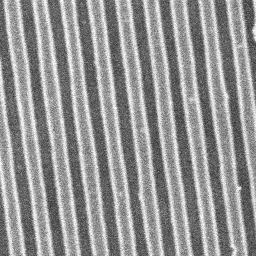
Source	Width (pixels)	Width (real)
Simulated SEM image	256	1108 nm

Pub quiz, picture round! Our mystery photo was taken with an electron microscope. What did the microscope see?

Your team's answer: parallel lines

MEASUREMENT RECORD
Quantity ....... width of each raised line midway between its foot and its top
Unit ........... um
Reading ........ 0.058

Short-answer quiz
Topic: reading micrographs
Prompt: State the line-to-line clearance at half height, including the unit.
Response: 0.058 µm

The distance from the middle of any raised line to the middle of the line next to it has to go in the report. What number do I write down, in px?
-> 27.5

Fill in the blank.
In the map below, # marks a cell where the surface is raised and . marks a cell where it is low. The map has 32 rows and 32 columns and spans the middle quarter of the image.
..###...####...####...####...###
..###...####...####...####...###
..###...####....###....###...###
..###...####....###....###...###
..###....###....###....###....##
..###....###....###....###....##
..###....###....###....###....##
..###....###....###....###....##
..####...###....####...####...##
..####...####...####...####...##
..####...####....###...####...##
...###....###....###...####...##
...###....###....###....###...##
...###....###....###....###....#
...###....###....###....###....#
...####...###....####...###....#
...####...###....####...####...#
...####...####....###...####...#
....###....###....###...####...#
....###....###....###...####....
....###....###....###...####....
....####...###....####...###....
#...####...###....####...###....
#...####...####...####...###....
#...####...####...####...###....
#...####...####....###...####...
#....###....###....###...####...
#....###....###....###....###...
##...####...###....###....###...
##...####...####...###....###...
##...####...####...###....###...
##...####...####...####...####..